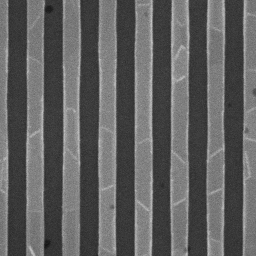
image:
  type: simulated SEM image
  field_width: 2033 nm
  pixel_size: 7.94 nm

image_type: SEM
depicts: wiring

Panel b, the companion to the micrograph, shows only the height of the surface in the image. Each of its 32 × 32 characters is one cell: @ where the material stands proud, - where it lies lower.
@--@@@--@@--@@@--@@---@@--@@---@
@--@@---@@--@@---@@---@@--@@---@
@--@@---@@--@@---@@--@@@--@@--@@
@--@@---@@--@@---@@--@@@--@@--@@
@--@@---@@--@@@--@@--@@@--@@--@@
@--@@---@@--@@@--@@--@@@--@@---@
@--@@---@@--@@@--@@--@@@--@@---@
@--@@---@@--@@@--@@--@@@--@@---@
@--@@---@@--@@@--@@--@@@--@@---@
@--@@---@@--@@---@@--@@@--@@---@
@--@@---@@--@@---@@--@@@--@@---@
@--@@---@@--@@---@@--@@@--@@---@
@--@@---@@--@@---@@--@@@--@@---@
@--@@---@@--@@---@@--@@@--@@---@
@--@@---@@--@@---@@--@@@--@@---@
@--@@---@@--@@---@@--@@@--@@---@
@--@@---@@--@@---@@--@@---@@--@@
@--@@---@@--@@---@@--@@---@@--@@
@--@@---@@--@@---@@--@@---@@--@@
@--@@---@@--@@---@@--@@---@@--@@
@--@@---@@--@@---@@--@@@--@@--@@
@--@@---@@--@@---@@--@@@--@@--@@
@--@@---@@--@@---@@--@@@--@@--@@
@--@@---@@--@@---@@--@@@--@@--@@
@--@@---@@--@@---@@--@@@--@@--@@
@--@@---@@--@@---@@--@@@--@@--@@
@--@@---@@--@@---@@--@@---@@--@@
@--@@---@@--@@---@@--@@---@@--@@
@--@@---@@--@@---@@--@@---@@--@@
@--@@---@@--@@---@@--@@---@@--@@
@--@@---@@--@@---@@--@@---@@--@@
@--@@---@@--@@---@@--@@---@@--@@